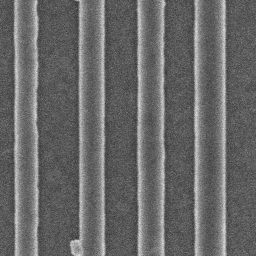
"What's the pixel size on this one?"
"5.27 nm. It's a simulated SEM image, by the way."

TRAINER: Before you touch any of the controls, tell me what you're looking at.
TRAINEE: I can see one or a few lines or trenches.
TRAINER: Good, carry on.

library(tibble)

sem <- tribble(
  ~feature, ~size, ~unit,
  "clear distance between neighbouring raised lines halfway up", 182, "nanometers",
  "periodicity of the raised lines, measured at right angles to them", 323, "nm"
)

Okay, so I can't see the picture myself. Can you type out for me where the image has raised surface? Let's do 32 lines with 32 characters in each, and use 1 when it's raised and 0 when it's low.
00110000001110000111100011110000
00110000001110000111000001110000
00111000001110000111000001110000
00111000001110000111000001110000
00111000001110000111000011110000
00110000001110000111000011110000
00111000001110000111000001110000
00111000001110000111000011110000
00111000001110000111000011110000
00111000001110000111000001110000
00111000001110000111000001110000
00111000001110000111000001110000
00111000001110000111000001110000
00111000001110000111000001110000
00111000001110000111000001110000
00111000001110000111000011110000
00111000001110000111000011110000
00111000001110000111000001110000
00111000001110000111000001110000
00111000001110000111000001110000
00111000001110000111000001110000
00111000001110000111000001110000
00111000001110000111000011110000
00111000001110000111000011110000
00111000001110000111000001110000
00111000001110000111000001110000
00111000001110000111000011110000
00111000001110000111000011110000
00111000001110000111000001110000
00111000001110000111000001110000
00111000011110000111000001110000
00111000011110000111000001110000